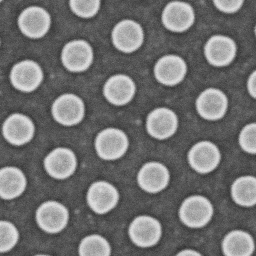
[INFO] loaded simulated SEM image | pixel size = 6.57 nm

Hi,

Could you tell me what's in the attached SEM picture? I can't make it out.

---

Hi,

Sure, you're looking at a regular array of raised bodies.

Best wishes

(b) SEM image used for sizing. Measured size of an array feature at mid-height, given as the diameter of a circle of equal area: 30.3 px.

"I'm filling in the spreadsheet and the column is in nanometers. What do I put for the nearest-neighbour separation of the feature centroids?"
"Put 354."